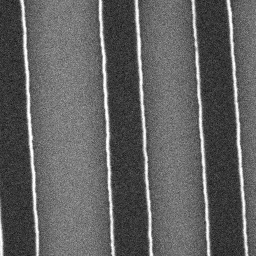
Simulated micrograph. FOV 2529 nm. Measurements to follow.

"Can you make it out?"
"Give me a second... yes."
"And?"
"lines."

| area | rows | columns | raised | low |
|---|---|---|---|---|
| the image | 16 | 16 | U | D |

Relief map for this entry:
UDDDDDUUUDDDUUDD
UUDDDDUUUDDDUUDD
UUDDDDUUUDDDUUUD
UUDDDDUUUDDDUUUD
UUDDDDUUUDDDUUUD
UUDDDDDUUDDDUUUD
UUDDDDDUUDDDUUUD
UUDDDDDUUDDDDUUD
UUDDDDDUUDDDDUUD
UUDDDDDUUDDDDUUD
UUDDDDDUUDDDDUUD
UUDDDDDUUDDDDUUD
UUDDDDDUUDDDDUUD
UUDDDDDUUDDDDUUD
UUDDDDDUUDDDDUUD
UUDDDDDUUDDDDUUD